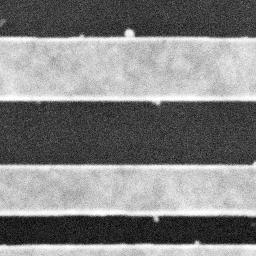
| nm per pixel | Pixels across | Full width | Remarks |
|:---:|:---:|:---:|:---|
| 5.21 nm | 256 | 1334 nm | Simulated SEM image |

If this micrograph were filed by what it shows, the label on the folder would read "lines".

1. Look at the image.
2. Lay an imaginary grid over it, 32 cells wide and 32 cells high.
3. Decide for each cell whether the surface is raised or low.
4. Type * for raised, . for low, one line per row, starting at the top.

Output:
................................
................................
................................
................................
................................
********************************
********************************
********************************
********************************
********************************
********************************
********************************
********************************
................................
................................
................................
................................
................................
................................
................................
................................
********************************
********************************
********************************
********************************
********************************
********************************
................................
................................
................................
................................
********************************